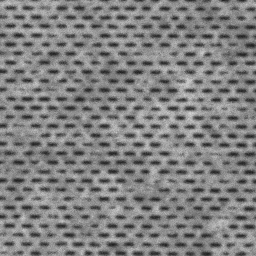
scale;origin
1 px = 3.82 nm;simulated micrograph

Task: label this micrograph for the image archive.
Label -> a regular array of holes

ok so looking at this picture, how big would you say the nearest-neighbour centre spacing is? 45.6 nm